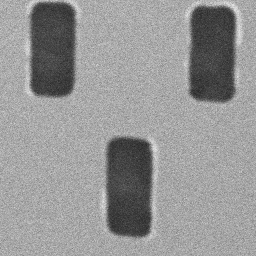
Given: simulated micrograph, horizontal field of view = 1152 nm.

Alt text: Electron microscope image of holes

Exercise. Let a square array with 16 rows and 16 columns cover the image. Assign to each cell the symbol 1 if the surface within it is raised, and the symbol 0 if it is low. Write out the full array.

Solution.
1100011111110011
1100011111110001
1100011111110001
1100011111110001
1100011111110001
1100011111110001
1111111111111111
1111111111111111
1111111111111111
1111111000111111
1111111000111111
1111111000111111
1111111000111111
1111111000111111
1111111001111111
1111111111111111